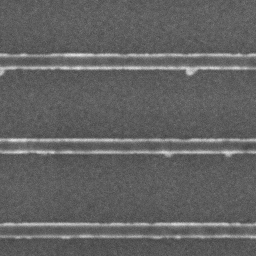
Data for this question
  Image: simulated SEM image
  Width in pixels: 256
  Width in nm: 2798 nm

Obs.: lines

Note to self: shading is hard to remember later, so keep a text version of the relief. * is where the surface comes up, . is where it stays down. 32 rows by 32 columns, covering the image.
................................
................................
................................
................................
................................
................................
................................
********************************
**.*****************************
................................
................................
................................
................................
................................
................................
................................
................................
**********************.*******.*
********************************
................................
................................
................................
................................
................................
................................
................................
................................
................................
********************************
********************************
................................
................................